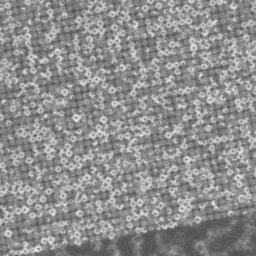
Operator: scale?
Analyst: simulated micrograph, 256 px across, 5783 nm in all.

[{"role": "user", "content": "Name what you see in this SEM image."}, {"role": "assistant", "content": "a regular array of holes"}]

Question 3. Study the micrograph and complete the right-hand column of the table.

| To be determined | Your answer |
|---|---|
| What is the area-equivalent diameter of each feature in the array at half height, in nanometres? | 67.4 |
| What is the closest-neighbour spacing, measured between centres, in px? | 6.45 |